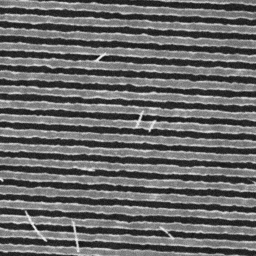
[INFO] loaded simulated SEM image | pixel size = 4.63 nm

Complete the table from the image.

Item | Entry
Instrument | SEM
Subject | parallel lines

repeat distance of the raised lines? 66.4 nanometers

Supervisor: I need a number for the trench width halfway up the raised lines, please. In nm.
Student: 34.7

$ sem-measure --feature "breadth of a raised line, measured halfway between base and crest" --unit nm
34.7